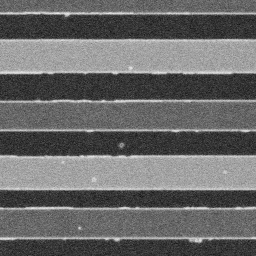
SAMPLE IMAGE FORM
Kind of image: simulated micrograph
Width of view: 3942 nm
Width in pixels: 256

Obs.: lines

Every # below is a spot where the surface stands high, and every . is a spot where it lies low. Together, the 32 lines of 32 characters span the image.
################################
################################
................................
................................
................................
################################
################################
################################
################################
................................
................................
................................
................................
################################
################################
################################
................................
................................
................................
................................
################################
################################
################################
################################
................................
................................
################################
################################
################################
################################
................................
................................